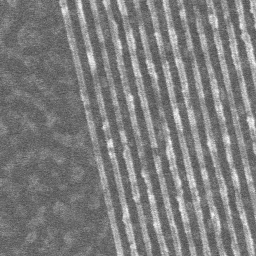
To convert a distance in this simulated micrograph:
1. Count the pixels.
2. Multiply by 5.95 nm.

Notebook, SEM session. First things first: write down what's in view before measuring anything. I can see parallel lines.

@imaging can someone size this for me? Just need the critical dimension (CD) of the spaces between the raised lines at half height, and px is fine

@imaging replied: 9.38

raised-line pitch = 14.2 px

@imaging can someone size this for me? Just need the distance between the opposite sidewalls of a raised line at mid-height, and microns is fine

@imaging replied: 0.0304